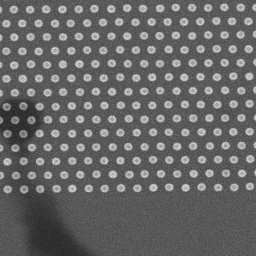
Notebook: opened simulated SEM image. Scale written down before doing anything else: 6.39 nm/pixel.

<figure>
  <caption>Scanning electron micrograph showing a regular array of raised bodies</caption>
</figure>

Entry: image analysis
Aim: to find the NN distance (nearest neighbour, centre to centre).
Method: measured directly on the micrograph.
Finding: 0.0996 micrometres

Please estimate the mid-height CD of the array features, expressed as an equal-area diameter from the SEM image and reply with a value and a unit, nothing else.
45.6 nm